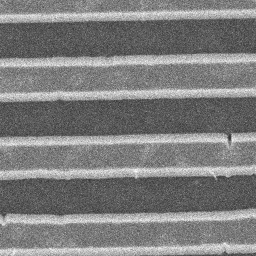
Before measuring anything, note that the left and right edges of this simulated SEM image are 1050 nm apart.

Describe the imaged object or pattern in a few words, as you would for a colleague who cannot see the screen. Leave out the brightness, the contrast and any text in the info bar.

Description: one or a few lines or trenches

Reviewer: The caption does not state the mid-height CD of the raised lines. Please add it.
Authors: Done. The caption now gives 150 nm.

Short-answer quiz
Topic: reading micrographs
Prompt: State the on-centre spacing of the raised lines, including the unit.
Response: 321 nanometres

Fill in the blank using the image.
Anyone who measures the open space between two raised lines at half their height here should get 171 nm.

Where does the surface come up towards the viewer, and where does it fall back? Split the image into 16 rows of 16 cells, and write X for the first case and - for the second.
XXXXXXXXXXXXXXXX
----------------
----------------
----------------
XXXXXXXXXXXXXXXX
XXXXXXXXXXXXXXXX
----------------
----------------
----------------
XXXXXXXXXXXXXXXX
XXXXXXXXXXXXXXXX
----------------
----------------
-----------XXXXX
XXXXXXXXXXXXXXXX
XXXXXXXXXXXXXXXX